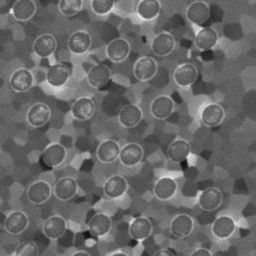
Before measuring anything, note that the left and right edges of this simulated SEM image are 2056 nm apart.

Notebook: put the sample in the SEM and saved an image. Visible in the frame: a regular array of holes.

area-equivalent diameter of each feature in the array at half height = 180 nm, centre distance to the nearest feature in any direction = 279 nm